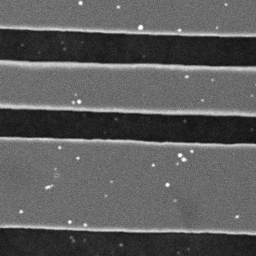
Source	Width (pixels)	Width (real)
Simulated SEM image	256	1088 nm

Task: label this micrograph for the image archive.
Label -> lines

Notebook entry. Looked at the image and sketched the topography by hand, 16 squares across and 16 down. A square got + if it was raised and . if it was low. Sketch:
++++++++++++++++
++++++++++++++++
................
................
++++++++++++++++
++++++++++++++++
++++++++++++++++
................
................
++++++++++++++++
++++++++++++++++
++++++++++++++++
++++++++++++++++
++++++++++++++++
............++++
................